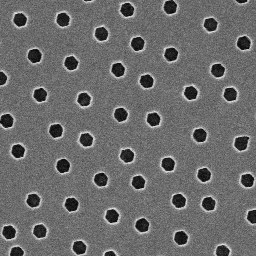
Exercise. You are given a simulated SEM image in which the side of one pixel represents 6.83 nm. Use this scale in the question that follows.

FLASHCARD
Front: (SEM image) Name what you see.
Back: a regular array of holes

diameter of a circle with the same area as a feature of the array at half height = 0.099 um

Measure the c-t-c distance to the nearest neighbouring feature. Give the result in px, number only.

35